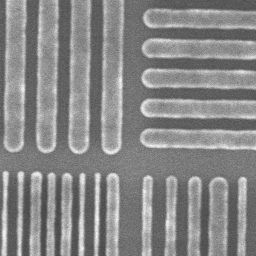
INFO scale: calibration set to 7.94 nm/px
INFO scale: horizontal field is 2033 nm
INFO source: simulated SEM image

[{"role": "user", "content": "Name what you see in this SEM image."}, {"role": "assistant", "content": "groups of lines, slits or small figures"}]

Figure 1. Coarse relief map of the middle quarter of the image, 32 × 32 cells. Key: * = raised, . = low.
..****....****..................
..****....****.......***.****...
..****....****......************
..****....****......************
..****....****......************
..****....****.......***********
..****....****..................
..****....****..................
..****....****..................
.*****....****......************
.*****....****.....*************
.*****....****.....*************
.*****....****......************
.*****....****..................
.*****....****..................
.*****....****..................
.*****....****.......********...
.*****....****......************
.*****....****.....*************
.*****....****......************
.*****....****.........*********
..****....***...................
................................
................................
................................
................................
................................
................................
**..*...*..**.......**....**....
**..*...*..**.......**....**...*
**..*...*..**.......**....**...*
**..*...*..**.......**....**...*